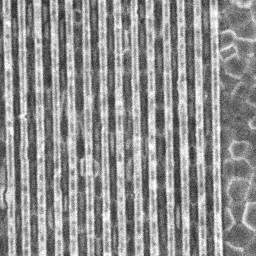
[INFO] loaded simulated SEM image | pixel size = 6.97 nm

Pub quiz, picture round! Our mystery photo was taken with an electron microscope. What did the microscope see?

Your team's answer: parallel lines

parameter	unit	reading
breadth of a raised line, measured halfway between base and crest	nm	40.1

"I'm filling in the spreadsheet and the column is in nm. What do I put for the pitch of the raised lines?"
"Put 111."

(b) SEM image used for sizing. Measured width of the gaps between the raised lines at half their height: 73.2 nm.